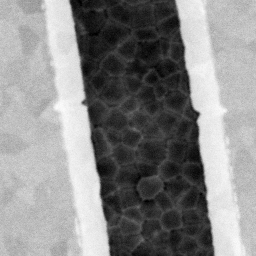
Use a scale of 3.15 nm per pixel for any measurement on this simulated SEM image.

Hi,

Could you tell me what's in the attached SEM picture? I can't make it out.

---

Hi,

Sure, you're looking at one or a few lines or trenches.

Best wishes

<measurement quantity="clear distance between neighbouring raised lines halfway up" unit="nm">415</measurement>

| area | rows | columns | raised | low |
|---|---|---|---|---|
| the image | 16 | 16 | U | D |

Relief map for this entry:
UUUUDDDDDDDDUUUU
UUUUDDDDDDDDUUUU
UUUUDDDDDDDDUUUU
UUUUDDDDDDDDUUUU
UUUUDDDDDDDDDUUU
UUUUDDDDDDDDDUUU
UUUUDDDDDDDDDUUU
UUUUUDDDDDDDDUUU
UUUUUDDDDDDDDUUU
UUUUUDDDDDDDDUUU
UUUUUDDDDDDDDDUU
UUUUUDDDDDDDDDUU
UUUUUUDDDDDDDDUU
UUUUUUDDDDDDDDUU
UUUUUUDDDDDDDDUU
UUUUUUDDDDDDDDUU